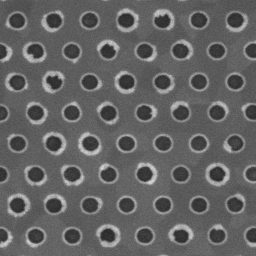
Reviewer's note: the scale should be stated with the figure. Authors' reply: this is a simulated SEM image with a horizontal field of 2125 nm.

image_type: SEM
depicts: a regular array of holes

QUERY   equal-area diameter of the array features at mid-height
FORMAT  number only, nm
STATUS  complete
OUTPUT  139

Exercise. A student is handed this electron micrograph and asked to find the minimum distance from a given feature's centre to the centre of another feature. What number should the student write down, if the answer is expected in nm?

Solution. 293